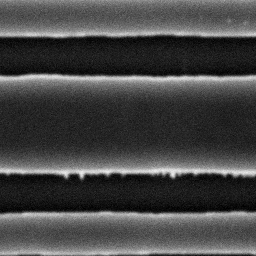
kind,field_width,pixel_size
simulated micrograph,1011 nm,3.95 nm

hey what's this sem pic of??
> lines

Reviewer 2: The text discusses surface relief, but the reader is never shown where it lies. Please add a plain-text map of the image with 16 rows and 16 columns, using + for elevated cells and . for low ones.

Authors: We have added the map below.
++++++++++++++++
++++++++++++++++
................
................
................
++++++++++++++++
++++++++++++++++
++++++++++++++++
++++++++++++++++
++++++++++++++++
++++++++++++++++
................
................
++++++++++++++++
++++++++++++++++
++++++++++++++++